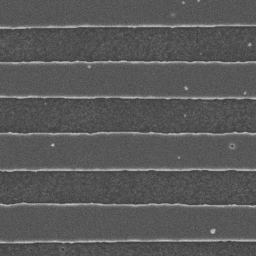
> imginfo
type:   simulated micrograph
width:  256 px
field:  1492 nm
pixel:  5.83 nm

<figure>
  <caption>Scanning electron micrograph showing lines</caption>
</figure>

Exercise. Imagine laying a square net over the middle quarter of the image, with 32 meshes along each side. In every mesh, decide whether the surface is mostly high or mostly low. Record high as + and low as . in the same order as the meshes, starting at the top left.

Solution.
++++++++++++++++++++++++++++++++
++++++++++++++++++++++++++++++++
++++++++++++++++++++++++++++++++
++++++++++++++++++++++++++++++++
++++++++++++++++++++++++++++++++
++++++++++++++++++++++++++++++++
++++++++++++++++++++++++++++++++
++++++++++++++++++++++++++++++++
.........................++.....
................................
................................
................................
................................
................................
................................
................................
................................
++++++.++++++++++++++++++.++.+++
++++++++++++++++++++++++++++++++
++++++++++++++++++++++++++++++++
++++++++++++++++++++++++++++++++
++++++++++++++++++++++++++++++++
++++++++++++++++++++++++++++++++
++++++++++++++++++++++++++++++++
++++++++++++++++++++++++++++++++
++++++++++++++++++++++++++++++++
+++++++++++++++.+++++..++++++++.
................................
................................
................................
................................
................................